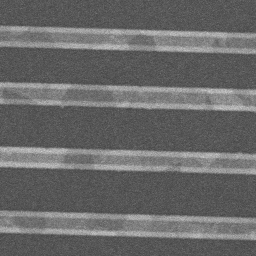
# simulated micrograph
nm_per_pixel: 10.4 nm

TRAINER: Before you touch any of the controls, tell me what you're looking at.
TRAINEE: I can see one or a few lines or trenches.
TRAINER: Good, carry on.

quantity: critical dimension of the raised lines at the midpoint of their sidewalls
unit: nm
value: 166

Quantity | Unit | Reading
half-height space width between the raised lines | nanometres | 499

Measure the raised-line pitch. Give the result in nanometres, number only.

643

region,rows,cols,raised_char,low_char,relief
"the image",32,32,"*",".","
................................
................................
................................
................................
*******************************.
.*******************************
................................
................................
................................
................................
................................
******************************..
********************************
..............................**
................................
................................
................................
................................
................................
*****************************...
********************************
................................
................................
................................
................................
................................
................................
*****************************...
********************************
..........................******
................................
................................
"